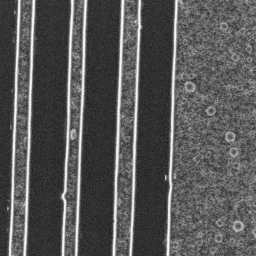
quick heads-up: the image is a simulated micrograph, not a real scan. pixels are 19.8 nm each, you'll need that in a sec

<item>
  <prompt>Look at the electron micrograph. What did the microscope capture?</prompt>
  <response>parallel lines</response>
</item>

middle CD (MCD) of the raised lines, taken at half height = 292 nm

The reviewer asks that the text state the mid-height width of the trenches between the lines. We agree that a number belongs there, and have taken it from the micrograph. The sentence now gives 36.9 px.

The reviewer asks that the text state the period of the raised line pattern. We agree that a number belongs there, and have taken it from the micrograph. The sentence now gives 1040 nm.